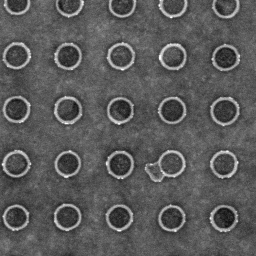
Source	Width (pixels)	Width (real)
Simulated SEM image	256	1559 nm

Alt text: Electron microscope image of a regular array of raised bodies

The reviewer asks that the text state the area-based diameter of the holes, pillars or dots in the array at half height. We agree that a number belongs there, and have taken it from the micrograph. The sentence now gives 152 nm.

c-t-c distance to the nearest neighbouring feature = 0.316 micrometres